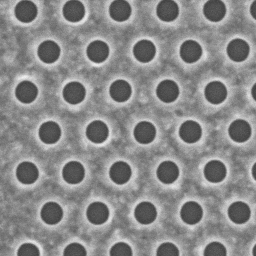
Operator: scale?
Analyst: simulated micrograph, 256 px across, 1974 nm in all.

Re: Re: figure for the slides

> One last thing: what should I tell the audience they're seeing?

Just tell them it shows a regular array of holes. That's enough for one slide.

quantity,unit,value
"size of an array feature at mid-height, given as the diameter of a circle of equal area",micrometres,0.183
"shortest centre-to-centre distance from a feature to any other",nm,353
